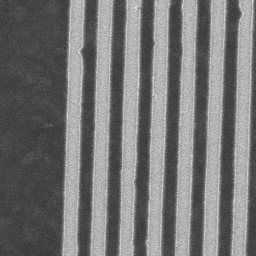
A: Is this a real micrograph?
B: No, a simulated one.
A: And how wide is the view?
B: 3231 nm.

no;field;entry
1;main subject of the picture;parallel lines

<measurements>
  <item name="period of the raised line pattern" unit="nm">355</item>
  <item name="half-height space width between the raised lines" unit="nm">151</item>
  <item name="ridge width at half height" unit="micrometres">0.202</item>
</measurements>